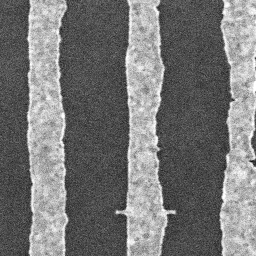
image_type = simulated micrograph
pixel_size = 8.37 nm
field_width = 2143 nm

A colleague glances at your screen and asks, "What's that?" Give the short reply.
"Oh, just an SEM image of one or a few lines or trenches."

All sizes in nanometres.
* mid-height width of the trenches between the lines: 560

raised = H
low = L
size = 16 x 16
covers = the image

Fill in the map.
LLHHLLLLHHLLLLHH
LLHHLLLLHHLLLLHH
LLHHLLLLHHLLLLHH
LLHHLLLLHHLLLLHH
LLHHLLLLHHLLLLHH
LLHHLLLLHHLLLLHH
LLHHLLLLHHLLLLHH
LLHHLLLLHHLLLLHH
LLHHLLLLHHLLLLHH
LLHHLLLLHHLLLLHH
LLHHLLLLHHLLLLHH
LLHHLLLLHHLLLLHH
LLHHLLLLHHLLLLHH
LLHHLLLLHHLLLLHH
LLHHLLLLHHLLLLHH
LLHHLLLLHHLLLLHH